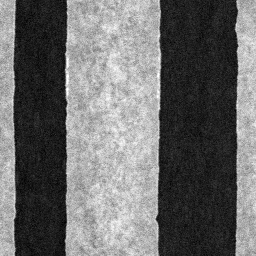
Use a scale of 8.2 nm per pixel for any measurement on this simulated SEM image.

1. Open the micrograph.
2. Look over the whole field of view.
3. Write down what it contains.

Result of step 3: one or a few lines or trenches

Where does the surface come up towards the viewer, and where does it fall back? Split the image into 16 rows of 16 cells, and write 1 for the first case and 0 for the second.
1000111111000001
1000111111000001
1000111111000001
1000111111000001
1000111111000001
1000111111000001
1000111111000001
1000111111000001
1000111111000001
1000111111000001
1000111111000001
1000111111000001
1000111111000001
1000111111000001
1000111111000001
1000111111000001